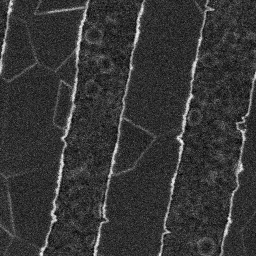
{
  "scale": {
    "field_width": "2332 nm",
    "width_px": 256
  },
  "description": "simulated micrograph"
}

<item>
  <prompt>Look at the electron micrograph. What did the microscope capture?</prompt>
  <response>one or a few lines or trenches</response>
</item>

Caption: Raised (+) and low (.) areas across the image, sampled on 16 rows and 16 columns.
.++++....++++...
+++++....++++...
+++++...+++++...
+++++...++++....
+++++...++++....
++++++..++++....
+++++...++++....
++++....++++...+
++++...++++....+
++++...++++....+
++++...++++....+
++++...++++....+
+++...+++++...++
+++...++++....++
+++...++++....++
+++...++++..++++